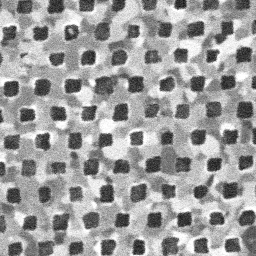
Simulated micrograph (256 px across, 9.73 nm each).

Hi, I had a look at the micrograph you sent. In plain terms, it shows a regular array of holes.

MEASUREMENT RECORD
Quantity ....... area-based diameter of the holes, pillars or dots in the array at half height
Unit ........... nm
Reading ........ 164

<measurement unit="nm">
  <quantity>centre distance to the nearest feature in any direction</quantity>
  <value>295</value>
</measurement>